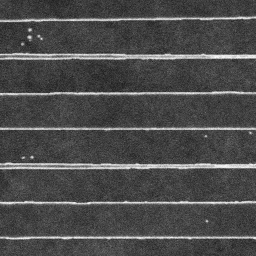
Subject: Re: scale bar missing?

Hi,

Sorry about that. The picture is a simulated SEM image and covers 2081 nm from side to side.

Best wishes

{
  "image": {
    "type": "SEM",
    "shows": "lines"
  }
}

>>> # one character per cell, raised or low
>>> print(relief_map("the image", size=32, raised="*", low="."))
********************************
********************************
***************.................
................................
................................
................................
................................
................................
................................
................................
................................
................................
********************************
********************************
********************************
********************************
................................
................................
................................
................................
*...............................
................................
................................
................................
................................
********************************
********************************
********************************
********************************
********************************
................................
................................